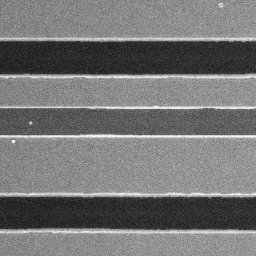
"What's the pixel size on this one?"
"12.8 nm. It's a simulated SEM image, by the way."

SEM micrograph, lines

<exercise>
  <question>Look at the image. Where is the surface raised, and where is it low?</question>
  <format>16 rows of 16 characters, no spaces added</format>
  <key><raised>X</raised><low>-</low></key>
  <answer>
XXXXXXXXXXXXXXXX
XXXXXXXXXXXXXXXX
----------------
----------------
----------------
XXXXXXXXXXXXXXXX
XXXXXXXXXXXXXXXX
XXXXXXXXXXXXXXXX
XXXXXXXXXXXXXXXX
XXXXXXXXXXXXXXXX
XXXXXXXXXXXXXXXX
XXXXXXXXXXXXXXXX
----------------
----------------
XXXXXXXXXXXXXXXX
XXXXXXXXXXXXXXXX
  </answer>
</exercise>